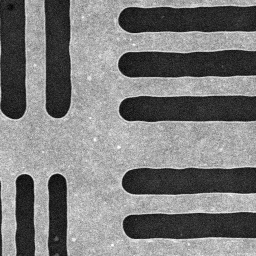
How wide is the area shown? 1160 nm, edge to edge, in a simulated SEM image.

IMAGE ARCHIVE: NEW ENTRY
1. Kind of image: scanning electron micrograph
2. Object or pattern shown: groups of lines, slits or small figures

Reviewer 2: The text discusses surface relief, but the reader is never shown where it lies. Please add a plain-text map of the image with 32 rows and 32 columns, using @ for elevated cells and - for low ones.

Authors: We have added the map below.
---@@----@@@@@@@@@@@@@@@@@@@@@@@
---@@@---@@@@@@-----------------
---@@@---@@@@@@-----------------
---@@@---@@@@@@-----------------
---@@@---@@@@@@@@@@@@@@@@@@@@@@@
---@@@---@@@@@@@@@@@@@@@@@@@@@@@
---@@@---@@@@@@@-----@@@--------
---@@@---@@@@@@-----------------
---@@@---@@@@@@-----------------
---@@@---@@@@@@@---------------@
---@@@---@@@@@@@@@@@@@@@@@@@@@@@
---@@@---@@@@@@@@@@@@@@@@@@@@@@@
---@@@---@@@@@@-----------------
---@@@---@@@@@@-----------------
@--@@@--@@@@@@@-----------------
@@@@@@@@@@@@@@@@@@@@@@@@@@@@@@@@
@@@@@@@@@@@@@@@@@@@@@@@@@@@@@@@@
@@@@@@@@@@@@@@@@@@@@@@@@@@@@@@@@
@@@@@@@@@@@@@@@@@@@@@@@@@@@@@@@@
@@@@@@@@@@@@@@@@@@@@@@@@@@@@@@@@
@@@@@@@@@@@@@@@@@@@@@@@@@@@@@@@@
@@@@@@@@@@@@@@@@----------------
@@--@@--@@@@@@@-----------------
@@--@@--@@@@@@@-----------------
@@--@@--@@@@@@@@@@@@@@@@@@@@@@@@
@@--@@--@@@@@@@@@@@@@@@@@@@@@@@@
@@--@@--@@@@@@@@@@@@@@@@@@@@@@--
@@--@@--@@@@@@@-----------------
@@--@@--@@@@@@@-----------------
@@--@@--@@@@@@@@----------------
@@--@@--@@@@@@@@@@@@@@@@@@@@@@@@
@@--@@--@@@@@@@@@@@@@@@@@@@@@@@@